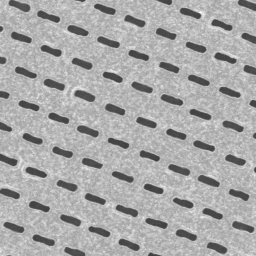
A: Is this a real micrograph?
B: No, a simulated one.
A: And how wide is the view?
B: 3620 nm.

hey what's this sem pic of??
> a regular array of holes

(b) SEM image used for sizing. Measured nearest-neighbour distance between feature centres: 454 nanometres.